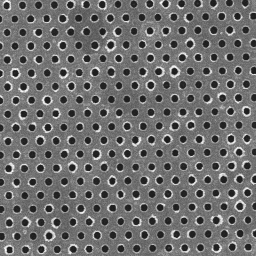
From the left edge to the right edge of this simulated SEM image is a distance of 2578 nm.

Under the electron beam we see a regular array of holes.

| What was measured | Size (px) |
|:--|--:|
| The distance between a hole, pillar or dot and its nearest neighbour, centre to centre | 15.4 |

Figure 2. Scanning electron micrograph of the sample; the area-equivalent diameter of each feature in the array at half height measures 72.8 nanometres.